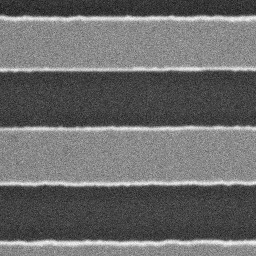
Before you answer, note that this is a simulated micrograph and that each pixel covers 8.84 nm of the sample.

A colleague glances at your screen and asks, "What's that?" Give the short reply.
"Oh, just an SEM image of lines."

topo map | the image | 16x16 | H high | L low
LLLLLLLLLLLLLLLL
HHHHHHHHHHHHHHHH
HHHHHHHHHHHHHHHH
HHHHHHHHHHHHHHHH
LLLLLLLLLLLLLLLL
LLLLLLLLLLLLLLLL
LLLLLLLLLLLLLLLL
LLLLLLLLLLLLLLLL
HHHHHHHHHHHHHHHH
HHHHHHHHHHHHHHHH
HHHHHHHHHHHHHHHH
HHHHHHHHHHHHHHHH
LLLLLLLLLLLLLLLL
LLLLLLLLLLLLLLLL
LLLLLLLLLLLLLLLL
HHHHHHHHHHHHHHHH